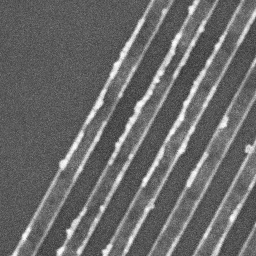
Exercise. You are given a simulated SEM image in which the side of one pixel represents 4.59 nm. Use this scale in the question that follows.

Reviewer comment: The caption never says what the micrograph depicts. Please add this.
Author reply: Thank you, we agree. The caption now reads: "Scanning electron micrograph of parallel lines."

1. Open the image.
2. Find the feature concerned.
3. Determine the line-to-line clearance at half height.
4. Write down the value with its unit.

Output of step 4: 95.4 nm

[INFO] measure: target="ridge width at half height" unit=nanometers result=86.8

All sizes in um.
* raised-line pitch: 0.182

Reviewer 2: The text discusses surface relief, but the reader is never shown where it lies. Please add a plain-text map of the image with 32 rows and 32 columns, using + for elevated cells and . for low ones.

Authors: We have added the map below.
...................++...+++...++
..................+++...++...+++
..................++...+++...+++
.................+++...++...+++.
.................++...+++...+++.
................+++...++...+++..
...............+++...+++...++...
...............+++...++...+++...
..............+++...+++...++...+
..............++...+++...+++...+
.............+++...+++..+++...++
.............++...+++...+++...++
............+++...++...+++...+++
............++...+++...+++...++.
...........+++...++...+++...+++.
...........++...+++...++....++..
..........+++...++...+++...+++..
..........++...+++...+++...++...
.........+++..+++...+++...++...+
........+++...+++...++...+++...+
........++...+++...+++...++...++
.......+++...+++...++...+++...++
.......++...+++...+++...++...+++
......+++...++....++...+++...++.
......++...+++...+++...++...+++.
.....+++...++....++...+++...++..
.....++...+++...+++...++...+++..
....+++..+++...+++...+++...++...
....++...+++...++...+++...+++...
...+++..+++...+++...+++..+++...+
...++...+++...++...+++...+++...+
..++...+++...+++...++...+++...++